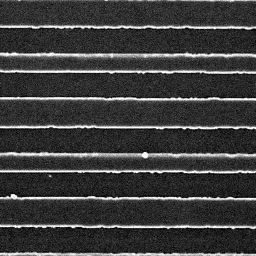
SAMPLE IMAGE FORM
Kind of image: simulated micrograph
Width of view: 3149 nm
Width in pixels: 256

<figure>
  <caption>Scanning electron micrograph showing lines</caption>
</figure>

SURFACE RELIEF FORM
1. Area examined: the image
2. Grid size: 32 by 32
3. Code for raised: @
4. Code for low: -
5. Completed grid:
@@@@@@@@@@@@@@@@@@@@@@@@@@@@@@@@
@@@@@@@@@@@@@@@@@@@@@@@@@@@@@@@@
@@@@@@@@@@@@@@@@@@@@@@@@@@@@@@@@
------------------------------@@
--------------------------------
--------------------------------
--------------------------------
@@@@@@@@@@@@@@@@@@@@@@@@@@@@@@@@
@@@@@@@@@@@@@@@@@@@@@@@@@@@@@@@@
--------------------------------
--------------------------------
--------------------------------
@@@@@@@@@@@@@@@@@@@@@@@@@@@@@@@@
@@@@@@@@@@@@@@@@@@@@@@@@@@@@@@@@
@@@@@@@@@@@@@@@@@@@@@@@@@@@@@@@@
@@@@@@@@@@@@@@@@@@@@@@@@@@@@@@@@
--------------------------------
--------------------------------
--------------------------------
@@@@@@@@@@@@@@@@@@@@@@@@@@@@@@@@
@@@@@@@@@@@@@@@@@@@@@@@@@@@@@@@@
---------@@--@@-@@@@@--@@@@@@@@@
--------------------------------
--------------------------------
-@------------------------------
@@@@@@@@@@@@@@@@@@@@@@@@@@@@@@@@
@@@@@@@@@@@@@@@@@@@@@@@@@@@@@@@@
@@@@@@@@@@@@@@@@@@@@@@@@@@@@@@@@
--------------------@@-------@-@
--------------------------------
--------------------------------
--------------------------------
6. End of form